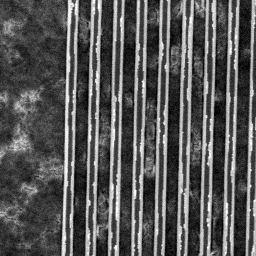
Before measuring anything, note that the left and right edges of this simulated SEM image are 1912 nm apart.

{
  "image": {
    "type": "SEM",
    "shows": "parallel lines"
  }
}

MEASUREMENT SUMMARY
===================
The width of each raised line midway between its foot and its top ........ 55.1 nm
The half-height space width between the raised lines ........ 0.116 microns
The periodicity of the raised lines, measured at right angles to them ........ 171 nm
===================